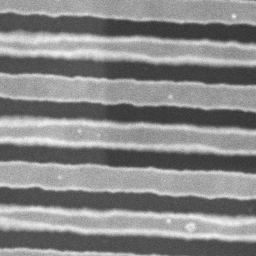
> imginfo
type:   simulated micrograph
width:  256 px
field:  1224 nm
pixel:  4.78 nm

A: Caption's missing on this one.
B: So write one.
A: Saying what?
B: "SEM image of lines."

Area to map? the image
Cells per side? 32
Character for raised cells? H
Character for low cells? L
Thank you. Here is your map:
HHHHHHHHHHHHHHHHHHHHHHHHHHHHHHHH
HHHHHHHHHHHHHHHHHHHHHHHHHHHHHHHH
LLLLLLLLLLLLLLLLHHHHHHHHHHHHHHHH
LLLLLLLLLLLLLLLLLLLLLLLLLLLLLLLL
HHHHHHHHHHHHLLLLLLLLLLLLLLLLLLLL
HHHHHHHHHHHHHHHHHHHHHHHHHHHHHHLL
HHHHHHHHHHHHHHHHHHHHHHHHHHHHHHHH
LLLLLLLLLLLLLLLLHHHHHHHHHHHHHHHH
LLLLLLLLLLLLLLLLLLLLLLLLLLLLLLLL
HHHHHHHLLLLLLLLLLLLLLLLLLLLLLLLL
HHHHHHHHHHHHHHHHHHHHHHHHHHLLLLLL
HHHHHHHHHHHHHHHHHHHHHHHHHHHHHHHH
LLLLHHHHHHHHHHHHHHHHHHHHHHHHHHHH
LLLLLLLLLLLLLLLLLLLLLLLLLHHHHHHH
LLLLLLLLLLLLLLLLLLLLLLLLLLLLLLLL
HHHHHHHHHHHHHHHHHHHLLLLLLLLLLLLL
HHHHHHHHHHHHHHHHHHHHHHHHHHHHHHHH
HHHHHHHHHHHHHHHHHHHHHHHHHHHHHHHH
LLLLLLLLLLLLLHHHHHHHHHHHHHHHHHHH
LLLLLLLLLLLLLLLLLLLLLLLLLLLLLLLL
HHHHHLHLLLLLLLLLLLLLLLLLLLLLLLLL
HHHHHHHHHHHHHHHHHHHHHHHHHHHHLLLL
HHHHHHHHHHHHHHHHHHHHHHHHHHHHHHHH
LLLLLHHHHHHHHHHHHHHHHHHHHHHHHHHH
LLLLLLLLLLLLLLLLLLLLLLHLHHHHHHHH
LLLLLLLLLLLLLLLLLLLLLLLLLLLLLLLL
HHHHHHHHHHHHHHHHHLLLLLLLLLLLLLLL
HHHHHHHHHHHHHHHHHHHHHHHHHHHHHHHH
HHHHHHHHHHHHHHHHHHHHHHHHHHHHHHHH
LLLLLLLLLLLLLLLLLLLLHHHHHHHHHHHH
LLLLLLLLLLLLLLLLLLLLLLLLLLLLLLLL
HHHHHHHHHLLLLLLLLLLLLLLLLLLLLLLL